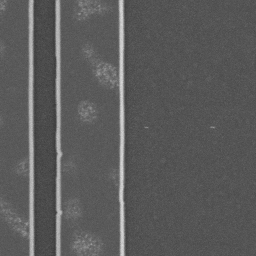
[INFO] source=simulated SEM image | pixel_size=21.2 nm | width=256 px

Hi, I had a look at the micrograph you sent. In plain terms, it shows one or a few lines or trenches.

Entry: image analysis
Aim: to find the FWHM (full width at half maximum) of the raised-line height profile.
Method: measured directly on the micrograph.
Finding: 1340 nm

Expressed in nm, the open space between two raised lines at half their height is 564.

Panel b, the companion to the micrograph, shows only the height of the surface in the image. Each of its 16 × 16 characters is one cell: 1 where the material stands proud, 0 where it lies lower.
1100111100000000
1100111100000000
1100111100000000
1100111100000000
1100111100000000
1100111100000000
1100111100000000
1100111100000000
1100111100000000
1100111100000000
1100111100000000
1100111100000000
1100111100000000
1100111100000000
1100111100000000
1100111100000000